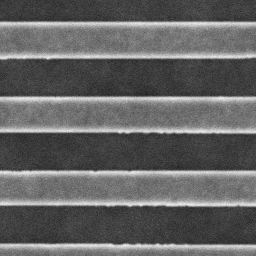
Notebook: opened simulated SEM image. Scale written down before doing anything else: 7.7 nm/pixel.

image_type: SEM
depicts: lines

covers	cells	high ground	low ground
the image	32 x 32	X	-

--------------------------------
--------------------------------
--------------------------------
XXXXXXXXXXXXXXXXXXXXXXXXXXXXXXXX
XXXXXXXXXXXXXXXXXXXXXXXXXXXXXXXX
XXXXXXXXXXXXXXXXXXXXXXXXXXXXXXXX
XXXXXXXXXXXXXXXXXXXXXXXXXXXXXXXX
--------------------------------
--------------------------------
--------------------------------
--------------------------------
--------------------------------
XXXXXXXXXXXXXXXXXXXXXXXXXXXXXXXX
XXXXXXXXXXXXXXXXXXXXXXXXXXXXXXXX
XXXXXXXXXXXXXXXXXXXXXXXXXXXXXXXX
XXXXXXXXXXXXXXXXXXXXXXXXXXXXXXXX
--------------XXX-X-XXXXXXXXXXXX
--------------------------------
--------------------------------
--------------------------------
--------------------------------
XXXXXXXXXXXXXXXXXXXXXXXXXXXXXXXX
XXXXXXXXXXXXXXXXXXXXXXXXXXXXXXXX
XXXXXXXXXXXXXXXXXXXXXXXXXXXXXXXX
XXXXXXXXXXXXXXXXXXXXXXXXXXXXXXXX
XXXXXXXXXXXXXXXXXXXXXXXXXXXXXXXX
--------------------------------
--------------------------------
--------------------------------
--------------------------------
--------------------------------
XXXXXXXXXXXXXXXXXXXXXXXXXXXXXXXX